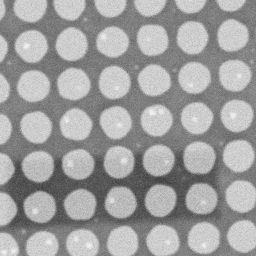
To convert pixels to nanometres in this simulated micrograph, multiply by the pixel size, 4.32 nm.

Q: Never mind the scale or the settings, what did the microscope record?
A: an array of small figures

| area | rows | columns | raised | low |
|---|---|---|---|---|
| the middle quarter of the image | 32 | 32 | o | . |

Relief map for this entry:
.....................ooo......oo
.ooo......ooooo.....ooooo....ooo
ooooo....ooooooo...ooooooo...ooo
oooooo...ooooooo...ooooooo...ooo
oooooo...ooooooo...ooooooo...ooo
oooooo...ooooooo...ooooooo...ooo
oooooo...ooooooo...ooooooo....oo
oooooo....ooooo.....oooo........
oooo.......o....................
................................
......................ooo......o
..oo......ooooo.....oooooo....oo
ooooo.....oooooo....ooooooo...oo
oooooo...oooooooo..oooooooo..ooo
ooooooo..oooooooo..oooooooo..ooo
ooooooo..oooooooo...ooooooo...oo
ooooooo...oooooo....oooooo.....o
oooooo.....ooooo......ooo.......
.oooo...........................
................................
...............................o
...o.......ooooo.....oooooo...oo
.ooooo.....oooooo...ooooooo...oo
ooooooo...ooooooo...ooooooo...oo
ooooooo...ooooooo...oooooooo..oo
ooooooo...ooooooo...ooooooo...oo
ooooooo...ooooooo....oooooo....o
.oooooo....ooooo......ooo.......
..ooo...........................
................................
......................ooo.......
...oo.......oooo.....oooooo....o